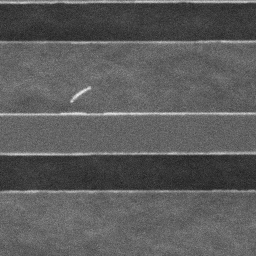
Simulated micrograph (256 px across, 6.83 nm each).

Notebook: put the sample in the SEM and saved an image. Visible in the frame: lines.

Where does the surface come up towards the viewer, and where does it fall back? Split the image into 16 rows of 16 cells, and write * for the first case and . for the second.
................
................
................
****************
****************
****************
****************
****************
****************
****************
................
................
****************
****************
****************
****************